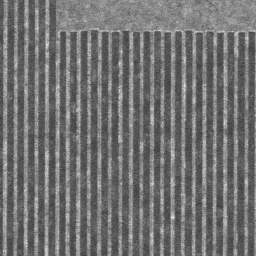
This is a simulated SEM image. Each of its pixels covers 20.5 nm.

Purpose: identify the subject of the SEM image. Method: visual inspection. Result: parallel lines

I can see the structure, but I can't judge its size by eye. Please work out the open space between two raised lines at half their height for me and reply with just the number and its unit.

0.161 microns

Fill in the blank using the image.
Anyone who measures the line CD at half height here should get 58.9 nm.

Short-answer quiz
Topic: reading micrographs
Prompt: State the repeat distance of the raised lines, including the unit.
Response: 215 nm